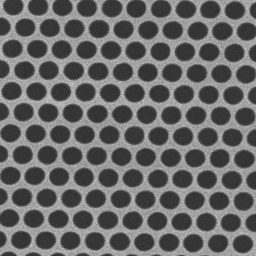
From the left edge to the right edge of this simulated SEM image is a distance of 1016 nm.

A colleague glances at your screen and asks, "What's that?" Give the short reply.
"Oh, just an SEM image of a regular array of holes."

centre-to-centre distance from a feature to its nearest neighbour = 0.0966 µm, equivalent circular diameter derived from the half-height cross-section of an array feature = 75.8 nm